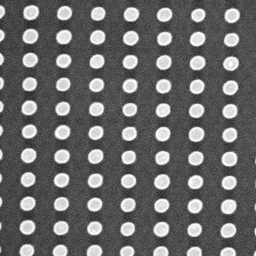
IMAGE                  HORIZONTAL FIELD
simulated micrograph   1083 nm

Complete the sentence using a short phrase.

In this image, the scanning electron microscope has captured a regular array of raised bodies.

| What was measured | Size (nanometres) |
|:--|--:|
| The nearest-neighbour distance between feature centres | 100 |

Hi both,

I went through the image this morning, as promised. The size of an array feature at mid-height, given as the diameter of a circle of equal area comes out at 57.9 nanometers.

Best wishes